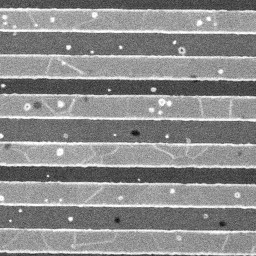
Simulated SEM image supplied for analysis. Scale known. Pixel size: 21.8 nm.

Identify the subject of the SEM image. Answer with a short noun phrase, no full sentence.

lines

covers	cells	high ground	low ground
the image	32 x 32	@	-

--------------------------------
@@@@@@@@@@@@@@@@@@@@@@@@@@@@@@@@
@@@@@@@@@@@@@@@@@@@@@@@@@@@@@@@@
@@@@@@@@@@@@@@@@@@@@@@@@@@@@@@@@
--------------------------------
--------------------------------
--------------------------------
@@@@@@@@@@@@@@@@@@@@@@@@@@@@@@@@
@@@@@@@@@@@@@@@@@@@@@@@@@@@@@@@@
@@@@@@@@@@@@@@@@@@@@@@@@@@@@@@@@
--------------------------------
--------------------------------
@@@@@@@@@@@@@@@@@@@@@@@@@@@@@@@@
@@@@@@@@@@@@@@@@@@@@@@@@@@@@@@@@
@@@@@@@@@@@@@@@@@@@@@@@@@@@@@@@@
--------------------------------
--------------------------------
--------------------------------
@@@@@@@@@@@@@@@@@@@@@@@@@@@@@@@@
@@@@@@@@@@@@@@@@@@@@@@@@@@@@@@@@
@@@@@@@@@@@@@@@@@@@@@@@@@@@@@@@@
--------------------------------
--------------------------------
@@@@@@@@@@@@@@@@@@@@@@@@@@@@@@@@
@@@@@@@@@@@@@@@@@@@@@@@@@@@@@@@@
@@@@@@@@@@@@@@@@@@@@@@@@@@@@@@@@
--------------------------------
--------------------------------
--------------------------------
@@@@@@@@@@@@@@@@@@@@@@@@@@@@@@@@
@@@@@@@@@@@@@@@@@@@@@@@@@@@@@@@@
-@@@@@@@@@@@@@@@@@@@@@@@@@@@@@@@